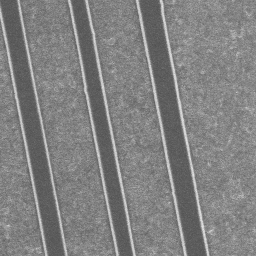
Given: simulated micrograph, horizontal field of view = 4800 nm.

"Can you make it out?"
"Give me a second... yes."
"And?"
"one or a few lines or trenches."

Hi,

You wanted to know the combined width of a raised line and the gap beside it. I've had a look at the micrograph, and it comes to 1.29 microns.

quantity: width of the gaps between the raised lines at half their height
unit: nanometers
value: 932